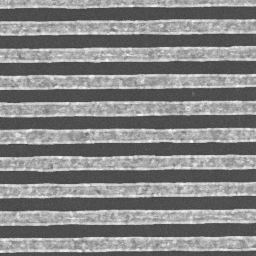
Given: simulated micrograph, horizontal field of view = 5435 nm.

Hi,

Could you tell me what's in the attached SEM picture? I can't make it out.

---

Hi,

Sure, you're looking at wiring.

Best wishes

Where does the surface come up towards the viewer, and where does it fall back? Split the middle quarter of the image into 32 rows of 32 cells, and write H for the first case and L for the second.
LLLLLLLLLLLLLLLLLLLLLLLLLLLLLLLL
LLLLLLLLLLLLLLLLLLLLLLLLLLLLLLLL
LLLLLLLLLLLLLLLLLLLLLLLLLLLLLLLL
HHHHHHHHHHHHHHHHHHHHHHHHHHHHHHHH
HHHHHHHHHHHHHHHHHHHHHHHHHHHHHHHH
HHHHHHHHHHHHHHHHHHHHHHHHHHHHHHHH
LLLLLLLLLLLLLLLLLLLLLLLLLLLLLLLL
LLLLLLLLLLLLLLLLLLLLLLLLLLLLLLLL
LLLLLLLLLLLLLLLLLLLLLLLLLLLLLLLL
LLLLLLLLLLLLLLLLLLLLLLLLLLLLLLLL
HHHHHHHHHHHHHHHHHHHHHHHHHHHHHHHH
HHHHHHHHHHHHHHHHHHHHHHHHHHHHHHHH
HHHHHHHHHHHHHHHHHHHHHHHHHLLLLLLL
LLLLLLLLLLLLLLLLLLLLLLLLLLLLLLLL
LLLLLLLLLLLLLLLLLLLLLLLLLLLLLLLL
LLLLLLLLLLLLLLLLLLLLLLLLLLLLLLLL
LLLLLLLLLLLLHHHHHHHHHLLLLLLLHHHH
HHHHHHHHHHHHHHHHHHHHHHHHHHHHHHHH
HHHHHHHHHHHHHHHHHHHHHHHHHHHHHHHH
HHHLLLLLLLLLLLLLLLLLLLLLLLLLLLLL
LLLLLLLLLLLLLLLLLLLLLLLLLLLLLLLL
LLLLLLLLLLLLLLLLLLLLLLLLLLLLLLLL
LLLLLLLLLLLLLLLLLLLLLLLLLLLLLLLL
LLLLLLLLLLLLLLHHHHHHHHHHHHHHHHHH
HHHHHHHHHHHHHHHHHHHHHHHHHHHHHHHH
HHHHHHHHHHHHHHHHHHHHHHHHHHHHHHHH
LLLLLLLLLLLLLLLLLLLLLLLLLLLLLLLL
LLLLLLLLLLLLLLLLLLLLLLLLLLLLLLLL
LLLLLLLLLLLLLLLLLLLLLLLLLLLLLLLL
LLLLLLLLLLLLLLLLLLLLLLLLLLLLLLLL
HHHHHHHHHHHHHHHHHHHHHHHHHHHHHHHH
HHHHHHHHHHHHHHHHHHHHHHHHHHHHHHHH